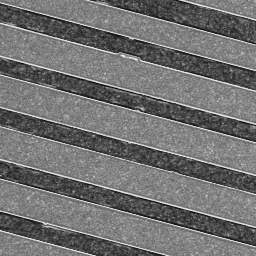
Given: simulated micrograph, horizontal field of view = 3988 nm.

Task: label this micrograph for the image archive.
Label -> parallel lines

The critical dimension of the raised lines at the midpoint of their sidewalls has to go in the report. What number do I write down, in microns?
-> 0.487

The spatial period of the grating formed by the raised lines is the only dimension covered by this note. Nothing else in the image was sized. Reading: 774 nanometres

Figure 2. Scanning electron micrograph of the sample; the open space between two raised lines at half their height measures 284 nanometers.